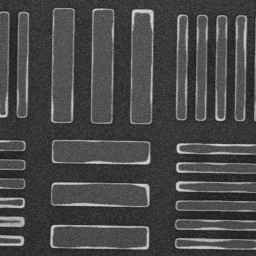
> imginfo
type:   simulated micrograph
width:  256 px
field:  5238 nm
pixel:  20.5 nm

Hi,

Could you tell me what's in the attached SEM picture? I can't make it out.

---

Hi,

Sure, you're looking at groups of lines, slits or small figures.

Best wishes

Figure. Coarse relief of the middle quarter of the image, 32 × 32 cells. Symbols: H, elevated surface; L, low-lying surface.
HHLLLLLHHHHHLLLLLHHHHHLLLLLLHHHL
HHLLLLLHHHHHLLLLLHHHHHLLLLLLHHHL
HHLLLLLHHHHHLLLLLHHHHHLLLLLLHHHL
HHLLLLLHHHHHLLLLLHHHHHLLLLLLHHHL
HHLLLLLHHHHHLLLLLHHHHHLLLLLLHHHL
HHLLLLLHHHHHLLLLLHHHHHLLLLLLHHHL
HHLLLLLHHHHHLLLLLHHHHHLLLLLLHHHL
HHLLLLLHHHHHLLLLLHHHHHLLLLLLHHHL
HHLLLLLHHHHHLLLLLHHHHHLLLLLLHHHL
HHLLLLLHHHHHLLLLLHHHHHLLLLLLHHHL
HHLLLLLHHHHHLLLLLHHHHHLLLLLLHHHL
HHLLLLLHHHHHLLLLLHHHHHLLLLLLHHHL
HHLLLLLHHHHHLLLLLHHHHHLLLLLLHHHL
HHLLLLLHHHHHLLLLLHHHHHLLLLLLHHLL
HHLLLLLHHHHHLLLLLHHHHHLLLLLLLLLL
LLLLLLLLLLLLLLLLLLLLLLLLLLLLLLLL
LLLLLLLLLLLLLLLLLLLLLLLLLLLLLLLL
LLLLLLLLLLLLLLLLLLLLLLLLLLLLLLLL
LLLLLLLLLLLLLLLLLLLLLLLLLLLLLLLL
HHHHHHHHHHHHHHHHHHHHLLLLLLLLLLLL
HHHHHHHHHHHHHHHHHHHHHLLLLLLLLHHH
HHHHHHHHHHHHHHHHHHHHHLLLLLLLLHHH
HHHHHHHHHHHHHHHHHHHHHLLLLLLLLLLL
HHHHHHHHHHHHHHHHHHHHHLLLLLLLLLLL
HHHHHHHHHHHHHHHHHHHHHLLLLLLLLLLL
LLLLLLLLLLLLLLLLLLLLLLLLLLLLHHHH
LLLLLLLLLLLLLLLLLLLLLLLLLLLLHHHH
LLLLLLLLLLLLLLLLLLLLLLLLLLLLLLLL
LLLLLLLLLLLLLLLLLLLLLLLLLLLLLLLL
LLLLLLLLLLLLLLLLLLLLLLLLLLLLLLLL
HHHHHHHHHHHHHHHHHHHHHLLLLLLLHHHH
HHHHHHHHHHHHHHHHHHHHHLLLLLLLLLHH